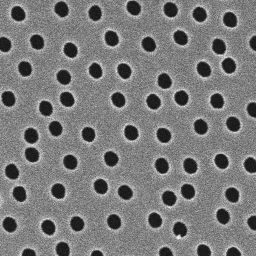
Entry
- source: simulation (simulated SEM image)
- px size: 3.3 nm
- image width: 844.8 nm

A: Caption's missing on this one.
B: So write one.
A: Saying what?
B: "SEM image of a regular array of holes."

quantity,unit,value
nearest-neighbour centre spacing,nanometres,94.6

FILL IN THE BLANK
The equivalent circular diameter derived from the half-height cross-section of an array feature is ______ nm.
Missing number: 47.9